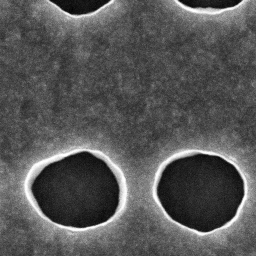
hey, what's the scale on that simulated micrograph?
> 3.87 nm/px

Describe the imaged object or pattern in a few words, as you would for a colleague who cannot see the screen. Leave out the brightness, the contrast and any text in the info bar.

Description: holes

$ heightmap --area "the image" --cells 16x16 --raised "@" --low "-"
@@@@--@@@@@@--@@
@@@@@@@@@@@@@@@@
@@@@@@@@@@@@@@@@
@@@@@@@@@@@@@@@@
@@@@@@@@@@@@@@@@
@@@@@@@@@@@@@@@@
@@@@@@@@@@@@@@@@
@@@@@@@@@@@@@@@@
@@@@@@@@@@@@@@@@
@@@@@-@@@@@@@@@@
@@-----@@@-----@
@@------@@-----@
@@------@@-----@
@@@----@@@@----@
@@@@@@@@@@@@@@@@
@@@@@@@@@@@@@@@@